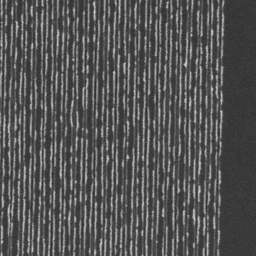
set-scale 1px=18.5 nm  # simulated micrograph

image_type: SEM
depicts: parallel lines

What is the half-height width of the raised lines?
132 nm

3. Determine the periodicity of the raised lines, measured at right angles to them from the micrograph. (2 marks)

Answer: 191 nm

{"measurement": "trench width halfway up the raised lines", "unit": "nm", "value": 60.2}